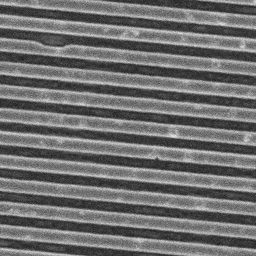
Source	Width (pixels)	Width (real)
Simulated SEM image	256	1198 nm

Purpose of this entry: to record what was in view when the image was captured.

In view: parallel lines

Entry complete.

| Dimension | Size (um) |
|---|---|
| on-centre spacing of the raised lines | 0.109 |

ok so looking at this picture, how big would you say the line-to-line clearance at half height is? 50.6 nanometers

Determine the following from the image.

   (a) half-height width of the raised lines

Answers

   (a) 59.4 nanometers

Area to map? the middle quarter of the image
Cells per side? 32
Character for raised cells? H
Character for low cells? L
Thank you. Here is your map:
LLLLLLLLLLLLLLLLLLLLLLLLHHHHHHHH
HHHHLLLLLLLLLLLLLLLLLLLLLLLLLLLL
HHHHHHHHHHHHHHLLLLLLLLLLLLLLLLLL
HHHHHHHHHHHHHHHHHHHHHHHHHHHLLLLL
LLLLHHHHHHHHHHHHHHHHHHHHHHHHHHHH
LLLLLLLLLLLLLLHHHHHHHHHHHHHHHHHH
LLLLLLLLLLLLLLLLLLLLLLLLLHHHHHHH
HHHHHHHLLLLLLLLLLLLLLLLLLLLLLLLL
HHHHHHHHHHHHHHHHHHLLLLLLLLLLLLLL
HHHHHHHHHHHHHHHHHHHHHHHHHHHHLLLL
LLLLLLLHHHHHHHHHHHHHHHHHHHHHHHHH
LLLLLLLLLLLLLLLLLLHHHHHHHHHHHHHH
LLLLLLLLLLLLLLLLLLLLLLLLLLLLHHHH
HHHHHHHHLLLLLLLLLLLLLLLLLLLLLLLL
HHHHHHHHHHHHHHHHHHHLLLLLLLLLLLLL
HHHHHHHHHHHHHHHHHHHHHHHHHHHHHLLL
LLLLLLLLHHHHHHHHHHHHHHHHHHHHHHHH
LLLLLLLLLLLLLLLLLLLHHHHHHHHHHHHH
HLLLLLLLLLLLLLLLLLLLLLLLLLLLLHHH
HHHHHHHHHLHLLLLLLLLLLLLLLLLLLLLL
HHHHHHHHHHHHHHHHHHHHHLLLLLLLLLLL
HHHHHHHHHHHHHHHHHHHHHHHHHHHHHHHL
LLLLLLLLLHLHHHHHHHHHHHHHHHHHHHHH
LLLLLLLLLLLLLLLLLLLLHHHHHHHHHHHH
HHLLLLLLLLLLLLLLLLLLLLLLLLLLLLHL
HHHHHHHHHHHHHLLLLLLLLLLLLLLLLLLL
HHHHHHHHHHHHHHHHHHHHHHHLLLLLLLLL
LLHHHHHHHHHHHHHHHHHHHHHHHHHHHHHH
LLLLLLLLLLLLLHHHHHHHHHHHHHHHHHHH
LLLLLLLLLLLLLLLLLLLLLLLHHHHHHHHH
HHHHHHLLLLLLLLLLLLLLLLLLLLLLLLLL
HHHHHHHHHHHHHHHLLLLLLLLLLLLLLLLL